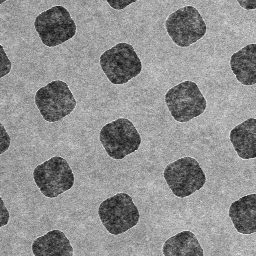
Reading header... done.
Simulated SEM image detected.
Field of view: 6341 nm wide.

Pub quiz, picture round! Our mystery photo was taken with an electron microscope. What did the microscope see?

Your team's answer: a regular array of holes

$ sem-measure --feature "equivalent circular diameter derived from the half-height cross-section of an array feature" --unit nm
983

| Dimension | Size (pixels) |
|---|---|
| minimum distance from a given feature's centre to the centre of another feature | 74.8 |